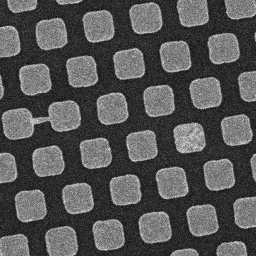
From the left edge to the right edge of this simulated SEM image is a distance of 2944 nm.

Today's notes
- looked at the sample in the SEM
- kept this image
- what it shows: a regular array of raised bodies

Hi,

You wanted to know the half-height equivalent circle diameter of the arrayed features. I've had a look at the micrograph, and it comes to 0.368 micrometres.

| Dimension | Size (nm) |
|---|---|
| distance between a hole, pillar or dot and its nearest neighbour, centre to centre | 544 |